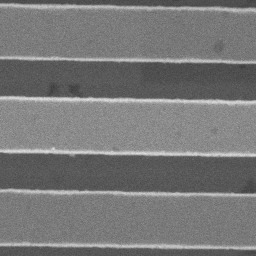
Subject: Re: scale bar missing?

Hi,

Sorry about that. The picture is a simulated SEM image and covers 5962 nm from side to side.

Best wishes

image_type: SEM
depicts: lines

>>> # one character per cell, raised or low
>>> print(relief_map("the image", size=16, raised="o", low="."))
oooooooooooooo..
oooooooooooooooo
oooooooooooooooo
oooooooooooooooo
................
................
oooooooooooooooo
oooooooooooooooo
oooooooooooooooo
oooooooooooooooo
................
................
oooooooooooooooo
oooooooooooooooo
oooooooooooooooo
...........ooooo